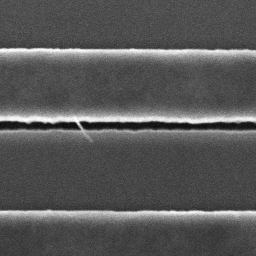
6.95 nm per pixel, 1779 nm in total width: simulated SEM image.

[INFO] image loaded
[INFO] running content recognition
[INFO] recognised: lines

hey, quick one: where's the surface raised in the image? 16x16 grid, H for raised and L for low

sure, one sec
LLLLLLLLLLLLLLLL
LLLLLLLLLLLLLLLL
LLLLLLLLLLLLLLLL
HHHHHHHHHHHHHHHH
HHHHHHHHHHHHHHHH
HHHHHHHHHHHHHHHH
HHHHHHHHHHHHHHHH
LLLLHLLLLLHHHHLL
LLLLLLLLLLLLLLLL
LLLLLLLLLLLLLLLL
LLLLLLLLLLLLLLLL
LLLLLLLLLLLLLLLL
LLLLLLLLLLLLLLLL
HHHHHHHHHHHHHHHH
HHHHHHHHHHHHHHHH
HHHHHHHHHHHHHHHH